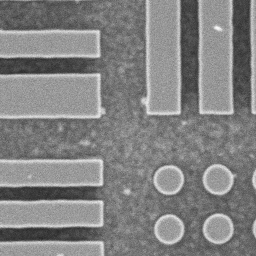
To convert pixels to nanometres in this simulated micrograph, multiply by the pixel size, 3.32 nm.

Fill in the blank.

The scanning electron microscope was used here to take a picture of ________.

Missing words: groups of lines, slits or small figures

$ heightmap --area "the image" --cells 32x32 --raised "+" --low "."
..................++++...++++..+
..................++++...++++..+
..................++++...++++..+
..................++++...++++..+
++++++++++++......++++...++++..+
++++++++++++......++++...++++..+
++++++++++++......++++...++++...
..................++++...++++..+
..................++++...++++..+
++++++++++++......+++++..++++...
++++++++++++......+++++..++++...
++++++++++++......+++++..++++...
++++++++++++......++++...++++...
++++++++++++......+++++..++++...
++++++++++++....................
................................
................................
................................
................................
................................
+++++++++++++...................
+++++++++++++.......+++...+++...
+++++++++++++......++++..++++...
....................+++...+++...
................................
+++++++++++++...................
+++++++++++++...................
+++++++++++++.......+++...+++...
...................++++..++++...
....................+++...+++...
+++++++++++++...................
+++++++++++++...................